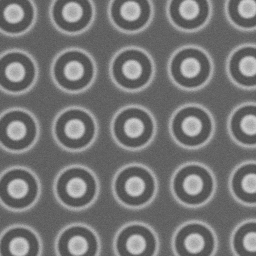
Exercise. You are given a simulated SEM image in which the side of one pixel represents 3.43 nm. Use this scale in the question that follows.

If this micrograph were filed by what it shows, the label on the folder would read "an array of small figures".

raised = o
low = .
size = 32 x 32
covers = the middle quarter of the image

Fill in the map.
.ooo...ooooo...oooo...oooo....oo
ooooo...oooo...oooo...oooo....oo
ooooo..ooooo...oooo...ooooo...oo
.ooo...ooooo..........ooooo.....
.......oooooo........ooooooo....
......oooooooo......ooooooooo...
....ooooooooooooo.oooooooooooooo
oooooooooooooooooooooooooooooooo
oooooooooooooooooooooooooooooooo
oooooooooooooooooooooooooooooooo
oooooooooooooooooooooooooooooooo
o....oooooooooo.....ooooooooo...
......oooooooo.......ooooooo....
.......oooooo.........ooooo....o
.ooo....oooo....ooo...ooooo...oo
.oooo...oooo...ooooo..ooooo...oo
ooooo...oooo...ooooo...oooo...oo
.oooo...oooo....ooo...ooooo....o
..o....oooooo.........oooooo....
.......ooooooo.......oooooooo...
......ooooooooo.....oooooooooo..
oooooooooooooooooooooooooooooooo
oooooooooooooooooooooooooooooooo
oooooooooooooooooooooooooooooooo
oooooooooooooooooooooooooooooooo
ooooooooooooooooo.oooooooooooo..
......ooooooooo......oooooooo...
.......oooooo.........oooooo....
........ooooo....oo...ooooo....o
.oooo...ooooo...oooo...oooo...oo
.oooo...oooo...ooooo...oooo...oo
.oooo...ooooo...oooo...oooo...oo